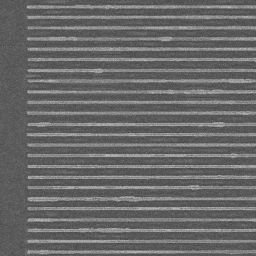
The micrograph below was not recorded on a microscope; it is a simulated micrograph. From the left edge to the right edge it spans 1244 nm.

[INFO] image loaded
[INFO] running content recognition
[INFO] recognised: parallel lines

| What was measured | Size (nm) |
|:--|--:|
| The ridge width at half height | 13.4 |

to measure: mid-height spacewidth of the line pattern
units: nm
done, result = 39.5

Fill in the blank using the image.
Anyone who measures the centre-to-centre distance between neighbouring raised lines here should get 51.8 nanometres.